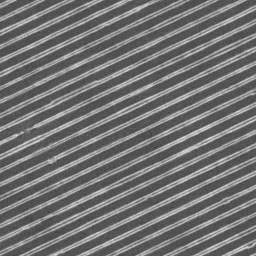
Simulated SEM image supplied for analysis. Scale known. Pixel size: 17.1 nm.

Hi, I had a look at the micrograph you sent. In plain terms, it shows parallel lines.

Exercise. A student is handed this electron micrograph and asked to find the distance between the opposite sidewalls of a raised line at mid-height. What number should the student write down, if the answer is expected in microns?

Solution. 0.0464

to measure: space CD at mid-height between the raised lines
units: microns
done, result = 0.168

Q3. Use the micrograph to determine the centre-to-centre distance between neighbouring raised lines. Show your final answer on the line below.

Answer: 213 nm